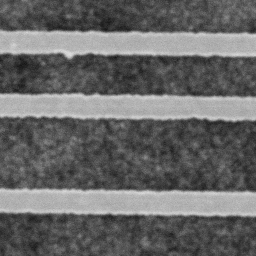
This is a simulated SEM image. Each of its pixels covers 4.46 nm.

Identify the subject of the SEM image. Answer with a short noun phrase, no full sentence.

lines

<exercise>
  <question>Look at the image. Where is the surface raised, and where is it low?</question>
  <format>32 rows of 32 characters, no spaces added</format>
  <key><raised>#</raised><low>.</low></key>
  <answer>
................................
................................
................................
................................
################################
################################
################################
................................
................................
................................
................................
................................
################################
################################
###.############################
................................
................................
................................
................................
................................
................................
................................
................................
................................
################################
################################
################################
................................
................................
................................
................................
................................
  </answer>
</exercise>